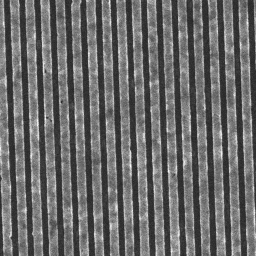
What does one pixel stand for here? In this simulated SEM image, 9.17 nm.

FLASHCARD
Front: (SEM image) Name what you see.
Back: parallel lines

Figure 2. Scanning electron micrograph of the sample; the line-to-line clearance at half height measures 6.37 px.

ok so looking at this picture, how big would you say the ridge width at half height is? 80.2 nanometres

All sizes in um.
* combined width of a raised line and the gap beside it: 0.14